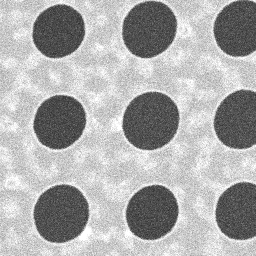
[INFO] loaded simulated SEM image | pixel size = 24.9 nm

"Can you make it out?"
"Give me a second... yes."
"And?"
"holes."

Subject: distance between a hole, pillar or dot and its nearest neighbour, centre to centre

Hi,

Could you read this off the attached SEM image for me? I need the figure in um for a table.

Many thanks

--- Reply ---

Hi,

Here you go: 2.27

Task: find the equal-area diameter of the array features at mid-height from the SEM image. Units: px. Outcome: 55